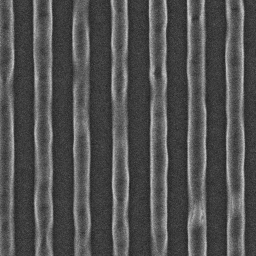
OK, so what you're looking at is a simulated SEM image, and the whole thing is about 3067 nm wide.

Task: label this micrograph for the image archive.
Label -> wiring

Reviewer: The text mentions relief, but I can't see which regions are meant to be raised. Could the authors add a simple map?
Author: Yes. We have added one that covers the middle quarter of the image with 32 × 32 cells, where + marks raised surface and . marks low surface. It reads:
...+++......+++.......+++......+
...++.......+++.......+........+
...++.......++++......+........+
...++.......++++......+.+......+
...+++......++++......+++......+
...+++......+++.......+++......+
...+++......+++.......+++.......
...+++......+++.......+++.......
...+++......+++.......+++.......
...+++......+++.......+++.......
...++........++.......+++.......
...++........++.......+++.......
...+++.......++.......+++.......
...+++.......++.......+++.......
...+++.......++.......+++......+
...+++.......++.......+++......+
...+++.......++.......+++......+
...+++.......++.......+++......+
...+++.......+++......+++......+
...+++.......+++......+++......+
...+++......++++......+++......+
...+++......++++......++++.....+
...+++......++++......++++.....+
...+++......++++......++++.....+
...+++......++++......++++.....+
...+++......++++......++++.....+
...+++......++++......++++.....+
...+++......++++......+++......+
...+++......++++......+++......+
...+++......++++......+++......+
...+++......++++......+++.......
...+++......++++......+++.......